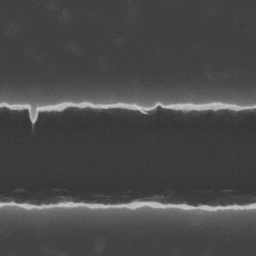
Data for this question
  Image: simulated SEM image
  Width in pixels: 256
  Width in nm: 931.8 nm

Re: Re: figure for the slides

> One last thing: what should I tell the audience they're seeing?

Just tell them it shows one or a few lines or trenches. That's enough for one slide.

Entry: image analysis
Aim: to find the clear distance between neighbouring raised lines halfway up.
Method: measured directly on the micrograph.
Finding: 356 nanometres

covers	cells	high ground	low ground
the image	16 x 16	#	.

################
################
################
################
################
################
################
................
................
................
................
................
................
################
################
################